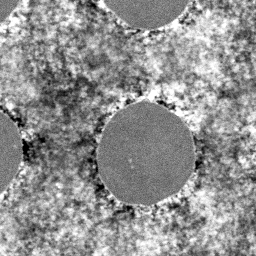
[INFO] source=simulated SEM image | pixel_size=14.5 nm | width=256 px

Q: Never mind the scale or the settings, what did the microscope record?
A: raised bodies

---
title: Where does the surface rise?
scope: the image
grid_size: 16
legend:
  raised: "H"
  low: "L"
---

HLLLLLLHHHHHLLLL
LLLLLLLLHHHLLLLL
LLLLLLLLLLLLLLLL
LLLLLLLLLLLLLLLL
LLLLLLLLLLLLLLLL
LLLLLLLLLLLLLLLL
LLLLLLLLHHLLLLLL
HLLLLLLHHHHLLLLL
HLLLLLHHHHHHLLLL
HLLLLLHHHHHHLLLL
HLLLLLHHHHHHLLLL
HLLLLLHHHHHHLLLL
LLLLLLLHHHLLLLLL
LLLLLLLLLLLLLLLL
LLLLLLLLLLLLLLLL
LLLLLLLLLLLLLLLL